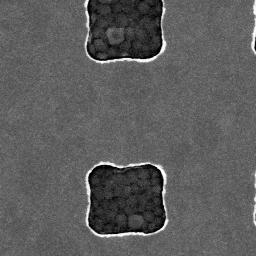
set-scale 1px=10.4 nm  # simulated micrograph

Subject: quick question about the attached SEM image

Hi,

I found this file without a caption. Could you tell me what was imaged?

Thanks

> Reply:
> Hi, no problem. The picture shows holes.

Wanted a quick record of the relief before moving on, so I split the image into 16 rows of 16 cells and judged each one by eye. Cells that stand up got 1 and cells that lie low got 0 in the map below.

1111100000111111
1111110000111111
1111100000111111
1111110000111111
1111111111111111
1111111111111111
1111111111111111
1111111111111111
1111111111111111
1111111111111111
1111110000111111
1111110000111111
1111110000111111
1111110000111111
1111110000111111
1111111111111111